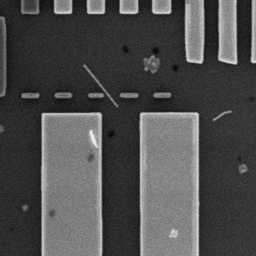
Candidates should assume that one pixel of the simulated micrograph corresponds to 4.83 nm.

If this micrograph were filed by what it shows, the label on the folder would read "wiring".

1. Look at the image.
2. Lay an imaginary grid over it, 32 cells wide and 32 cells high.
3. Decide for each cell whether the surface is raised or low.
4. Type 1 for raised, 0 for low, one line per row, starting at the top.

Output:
00011001100110011001100110011000
00011001100110011001100110011000
00000000000000000000000110011000
10000000000000000000000110011000
10000000000000000000000110011000
10000000000000000000000110011000
10000000000000000000000110011100
10000000000000000000000010001100
10000000000000000000000000000000
10000000000000000000000000000000
10000000000000000000000000000000
10000000000000000000000000000000
00000000000000000000000000000000
00000000000000000000000000000000
00000111111110000011111110000000
00000111111110000011111110000000
00000111111110000011111110000000
00000111111110000011111110000000
00000111111110000011111110000000
00000111111110000011111110000000
00000111111110000011111110000000
00000111111110000011111110000000
00000111111110000011111110000000
00000111111110000011111110000000
00000111111110000011111110000000
00000111111110000011111110000000
00000111111110000011111110000000
00000111111110000011111110000000
00000111111110000011111110000000
00000111111110000011111110000000
00000111111110000011111110000000
00000111111110000011111110000000